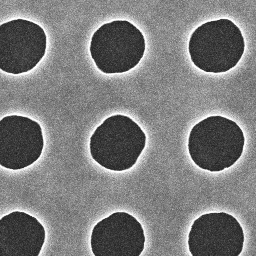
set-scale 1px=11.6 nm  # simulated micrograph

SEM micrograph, holes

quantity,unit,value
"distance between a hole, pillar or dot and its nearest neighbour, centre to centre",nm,1120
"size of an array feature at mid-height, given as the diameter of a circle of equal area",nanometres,635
